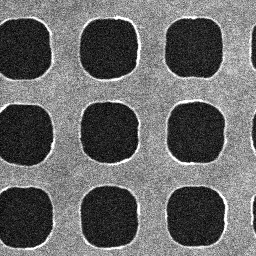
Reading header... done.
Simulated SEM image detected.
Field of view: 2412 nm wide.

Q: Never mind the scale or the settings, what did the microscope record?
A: holes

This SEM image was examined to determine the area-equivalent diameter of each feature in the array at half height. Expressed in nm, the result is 591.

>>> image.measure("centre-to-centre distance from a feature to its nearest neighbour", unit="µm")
0.786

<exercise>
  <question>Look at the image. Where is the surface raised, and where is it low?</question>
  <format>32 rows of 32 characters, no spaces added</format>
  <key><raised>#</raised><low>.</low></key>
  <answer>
################################
################################
#....#######....######....######
......#####......####......#####
......####.......####.......###.
......####.......####.......###.
......####.......####.......###.
.......###.......####.......###.
......####.......####......#####
.....######....#######.....#####
################################
################################
################################
#....######.....######.....#####
......####.......####.......####
......####.......####.......####
.......###.......####.......###.
.......###.......####.......####
......####.......####.......####
......#####.....######.....#####
#....###########################
################################
################################
##...#######...#######....######
......#####......####.......####
.......###.......####.......####
.......###.......####.......####
.......###.......####.......####
.......###.......####.......####
......####.......####.......####
#....######.....######.....#####
################################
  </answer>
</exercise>